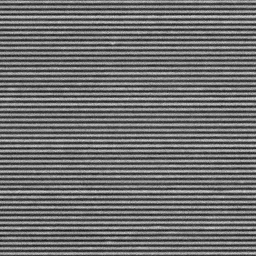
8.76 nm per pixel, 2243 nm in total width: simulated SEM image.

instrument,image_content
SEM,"parallel lines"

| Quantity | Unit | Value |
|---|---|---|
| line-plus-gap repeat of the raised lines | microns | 0.045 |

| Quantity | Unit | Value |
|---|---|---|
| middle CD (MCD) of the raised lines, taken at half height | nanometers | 23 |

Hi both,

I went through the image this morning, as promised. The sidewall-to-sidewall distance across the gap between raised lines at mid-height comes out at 23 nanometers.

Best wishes